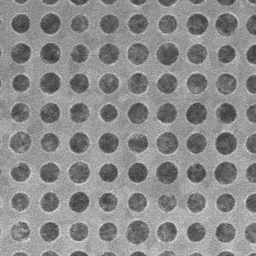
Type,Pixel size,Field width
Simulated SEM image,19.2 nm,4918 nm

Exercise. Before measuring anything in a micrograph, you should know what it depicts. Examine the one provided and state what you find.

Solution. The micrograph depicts a regular array of holes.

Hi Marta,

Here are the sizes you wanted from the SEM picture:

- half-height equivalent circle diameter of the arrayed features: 392 nm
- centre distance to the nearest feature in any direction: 558 nanometres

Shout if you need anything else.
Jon